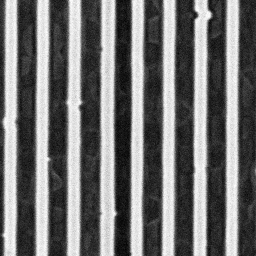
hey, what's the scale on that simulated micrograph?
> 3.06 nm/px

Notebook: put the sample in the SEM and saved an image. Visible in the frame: parallel lines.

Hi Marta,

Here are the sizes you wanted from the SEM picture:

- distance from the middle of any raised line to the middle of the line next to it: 31.6 pixels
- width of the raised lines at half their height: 38.6 nm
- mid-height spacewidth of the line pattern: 57.7 nm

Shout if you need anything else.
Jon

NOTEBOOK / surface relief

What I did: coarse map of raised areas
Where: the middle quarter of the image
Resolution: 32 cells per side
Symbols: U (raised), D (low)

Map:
DUUUDDDDDUUUUDDDDUUUDDDDDUUUDDDD
DUUUDDDDDUUUUDDDDUUUDDDDDUUUDDDD
DUUUDDDDDUUUUDDDDUUUDDDDDUUUDDDD
DUUUDDDDDUUUUDDDDUUUDDDDDUUUDDDD
DUUUDDDDDUUUUDDDDUUUDDDDDUUUDDDD
DUUUDDDDDUUUUDDDDUUUDDDDDUUUDDDD
DUUUDDDDDUUUUDDDDUUUDDDDDUUUDDDD
DUUUDDDDDUUUUDDDDUUUDDDDDUUUDDDD
DUUUDDDDDUUUUDDDDUUUDDDDDUUUDDDD
DUUUDDDDDUUUUDDDDUUUDDDDDUUUDDDD
DUUUDDDDDUUUUDDDDUUUDDDDDUUUDDDD
DUUUDDDDDUUUUDDDDUUUDDDDDUUUDDDD
DUUUDDDDDUUUUDDDDUUUDDDDDUUUDDDD
DUUUDDDDDUUUUDDDDUUUDDDDDUUUDDDD
DUUUDDDDDUUUUDDDDUUUDDDDDUUUDDDD
DUUUDDDDDUUUDDDDDUUUDDDDDUUUDDDD
DUUUDDDDDUUUDDDDDUUUDDDDDUUUDDDD
DUUUDDDDDUUUDDDDDUUUDDDDDUUUDDDD
DUUUDDDDDUUUUDDDDUUUDDDDDUUUDDDD
DUUUDDDDDUUUUDDDDUUUDDDDDUUUDDDD
DUUUDDDDDUUUUDDDDUUUDDDDDUUUDDDD
DUUUDDDDDUUUUDDDDUUUDDDDDUUUDDDD
DUUUDDDDDUUUUDDDDUUUDDDDDUUUDDDD
DUUUDDDDDUUUUDDDDUUUDDDDDUUUDDDD
DUUUDDDDDUUUUDDDDUUUDDDDDUUUDDDD
DUUUDDDDDUUUUDDDDUUUDDDDDUUUDDDD
DUUUDDDDDUUUUDDDDUUUDDDDDUUUDDDD
DUUUDDDDDUUUUDDDDUUUDDDDDUUUDDDD
DUUUDDDDDUUUUDDDDUUUDDDDDUUUDDDD
DUUUDDDDDUUUUDDDDUUUDDDDDUUUDDDD
DUUUDDDDDUUUUDDDDUUUDDDDDUUUDDDD
DUUUDDDDDUUUUDDDDUUUDDDDDUUUDDDD